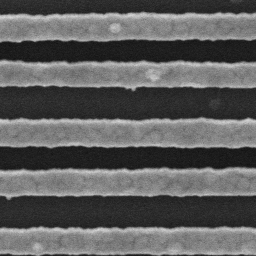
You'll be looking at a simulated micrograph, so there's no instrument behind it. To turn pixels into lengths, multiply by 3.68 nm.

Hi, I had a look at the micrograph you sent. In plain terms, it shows lines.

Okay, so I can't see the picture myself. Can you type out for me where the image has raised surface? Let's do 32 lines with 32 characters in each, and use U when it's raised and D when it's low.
DDDDDDDDDDDDDDDDDDDDDDDDDDDDDDDD
DDDDDDDDDDDDDDDDDDDDDDDDDDDDDDDD
UUUUUUUUUUUUUUUUUUUUUUUUUUUUUUUU
UUUUUUUUUUUUUUUUUUUUUUUUUUUUUUUU
UUUUUUUUUUUUUUUUUUUUUUUUUUUUUUUU
DDDDDDDDDDDDDDDDDDDDDDDDDDDDDDDD
DDDDDDDDDDDDDDDDDDDDDDDDDDDDDDDD
DDDDDDDDDDDDDDDDDDDDDDDDDDDDDDDD
UUUUUUUUUUUUUUUUUUUUUUUUUUUUUUUU
UUUUUUUUUUUUUUUUUUUUUUUUUUUUUUUU
UUUUUUUUUUUUUUUUUUUUUUUUUUUUUUUU
DDDDDDDDDDDDDDDDDDDDDDDDDDDDDDDD
DDDDDDDDDDDDDDDDDDDDDDDDDDDDDDDD
DDDDDDDDDDDDDDDDDDDDDDDDDDDDDDDD
DDDDDDDDDDDDDDDDDDDDDDDDDDDDDDDD
UUUUUUUUUUUUUUUUUUUUUUUUUUUUUUUU
UUUUUUUUUUUUUUUUUUUUUUUUUUUUUUUU
UUUUUUUUUUUUUUUUUUUUUUUUUUUUUUUU
DDDDDDDDDDDDDDDDDDDDDDDDDDDDDDDD
DDDDDDDDDDDDDDDDDDDDDDDDDDDDDDDD
DDDDDDDDDDDDDDDDDDDDDDDDDDDDDDDD
UUUUUUUUUUUUUUUUUUUUUUUUUUUUUUUU
UUUUUUUUUUUUUUUUUUUUUUUUUUUUUUUU
UUUUUUUUUUUUUUUUUUUUUUUUUUUUUUUU
UUUDDDDUDUDDDUDDDUUDDDUDDDDDDDDD
DDDDDDDDDDDDDDDDDDDDDDDDDDDDDDDD
DDDDDDDDDDDDDDDDDDDDDDDDDDDDDDDD
DDDDDDDDDDDDDDDDDDDDDDDDDDDDDDDD
DDDDUUDDDDDDDDDDUUDUDDUUUDDUUUUD
UUUUUUUUUUUUUUUUUUUUUUUUUUUUUUUU
UUUUUUUUUUUUUUUUUUUUUUUUUUUUUUUU
UUUUUUUUUUUUUUUUUUUUUUUUUUUUUUUU